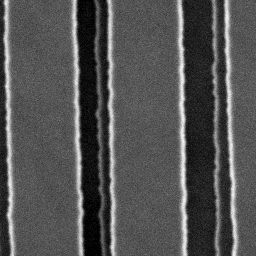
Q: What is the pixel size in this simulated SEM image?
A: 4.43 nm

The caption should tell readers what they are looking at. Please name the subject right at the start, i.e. lines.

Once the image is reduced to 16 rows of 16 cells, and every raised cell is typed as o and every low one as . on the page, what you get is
ooooo..oooo...oo
ooooo..oooo...oo
ooooo..oooo...oo
ooooo..oooo...oo
ooooo..oooo...oo
ooooo..oooo...oo
ooooo..oooo...oo
ooooo..oooo...oo
ooooo..oooo...oo
ooooo..ooooo..oo
.oooo..oooo...oo
.oooo..ooooo..oo
.oooo..ooooo..oo
.oooo..ooooo..oo
.oooo..ooooo...o
.oooo..ooooo...o